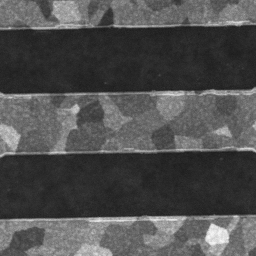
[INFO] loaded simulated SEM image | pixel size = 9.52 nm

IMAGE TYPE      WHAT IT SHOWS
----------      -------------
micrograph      one or a few lines or trenches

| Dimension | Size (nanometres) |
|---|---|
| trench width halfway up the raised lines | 635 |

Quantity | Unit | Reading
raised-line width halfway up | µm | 0.554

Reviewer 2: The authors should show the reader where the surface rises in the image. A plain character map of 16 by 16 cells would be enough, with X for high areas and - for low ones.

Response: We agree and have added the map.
XXXXXXXXXXXXXXXX
XXXXXXXXXXXXXXX-
----------------
----------------
----------------
----------------
XXXXXXXXXXXXXXXX
XXXXXXXXXXXXXXXX
XXXXXXXXXXXXXXXX
XXXXX-----------
----------------
----------------
----------------
----------------
XXXXXXXXXXXXXXXX
XXXXXXXXXXXXXXXX